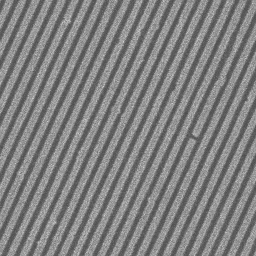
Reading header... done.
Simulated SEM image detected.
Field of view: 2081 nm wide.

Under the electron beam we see parallel lines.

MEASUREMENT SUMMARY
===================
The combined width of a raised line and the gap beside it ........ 96.1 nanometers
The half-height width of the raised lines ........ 6.15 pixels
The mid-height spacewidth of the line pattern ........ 0.0425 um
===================